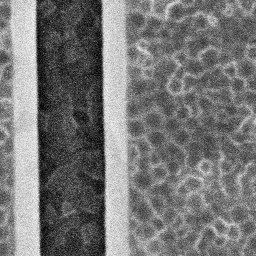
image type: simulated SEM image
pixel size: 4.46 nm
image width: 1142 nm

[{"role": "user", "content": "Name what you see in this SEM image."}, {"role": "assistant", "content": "one or a few lines or trenches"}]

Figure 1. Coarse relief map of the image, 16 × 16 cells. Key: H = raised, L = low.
HHLLLLLHHHHHHHHH
HHLLLLLHHHHHHHHH
HHLLLLLHHHHHHHHH
HHLLLLLHHHHHHHHH
HHLLLLLHHHHHHHHH
HHLLLLLHHHHHHHHH
HHLLLLLHHHHHHHHH
HHLLLLLHHHHHHHHH
HHLLLLLHHHHHHHHH
HHLLLLLHHHHHHHHH
HHLLLLLHHHHHHHHH
HHLLLLLHHHHHHHHH
HHLLLLLHHHHHHHHH
HHLLLLLHHHHHHHHH
HHLLLLLHHHHHHHHH
HHLLLLLHHHHHHHHH